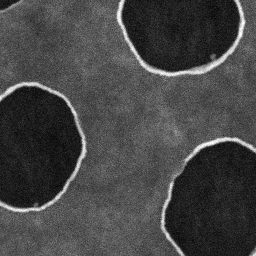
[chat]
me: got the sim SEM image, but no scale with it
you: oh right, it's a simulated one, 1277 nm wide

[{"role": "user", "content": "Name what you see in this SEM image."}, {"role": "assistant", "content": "holes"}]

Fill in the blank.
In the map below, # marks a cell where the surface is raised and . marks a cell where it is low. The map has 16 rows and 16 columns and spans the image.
########.......#
########.......#
########.......#
#########.....##
################
#..#############
....############
.....###########
.....###########
.....#######....
.....######.....
....#######.....
...########.....
##########......
##########......
###########.....